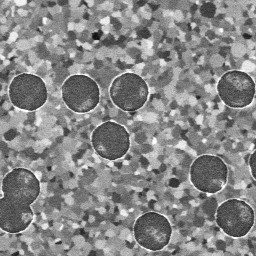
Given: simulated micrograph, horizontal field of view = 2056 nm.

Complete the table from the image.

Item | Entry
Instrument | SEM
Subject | a regular array of holes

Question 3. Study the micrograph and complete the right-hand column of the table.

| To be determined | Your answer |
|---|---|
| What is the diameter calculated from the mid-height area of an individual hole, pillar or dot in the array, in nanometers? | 310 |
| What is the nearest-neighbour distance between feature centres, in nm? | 413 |